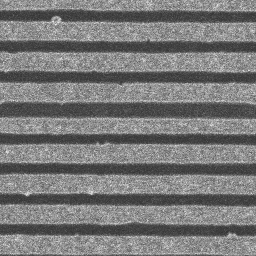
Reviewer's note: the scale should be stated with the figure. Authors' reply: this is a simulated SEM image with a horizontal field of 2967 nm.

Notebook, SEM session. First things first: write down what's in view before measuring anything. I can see parallel lines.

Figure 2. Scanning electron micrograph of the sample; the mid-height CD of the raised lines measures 227 nm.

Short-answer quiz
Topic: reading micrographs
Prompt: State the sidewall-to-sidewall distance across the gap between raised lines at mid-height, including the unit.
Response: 129 nm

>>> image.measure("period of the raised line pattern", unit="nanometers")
354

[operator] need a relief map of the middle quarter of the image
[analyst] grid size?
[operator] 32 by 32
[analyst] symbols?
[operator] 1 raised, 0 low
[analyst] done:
11111111111111111111111111111111
11111111111111111111111111111111
00000000000000000000000000000000
00000000000000000000000000000000
00000000000000000000000000000000
11111111111111111111111111111111
11111111111111111111111111111111
11111111111111111111111111111111
11111111111111111111111111111111
10000110000011111111111111111111
00000000000000000000000000000000
00000000000000000000000000000000
00000000000000000000000000000000
00000111111111110000000000000000
11111111111111111111111111111111
11111111111111111111111111111111
11111111111111111111111111111111
00001110000000000000000001111111
00000000000000000000000000000000
00000000000000000000000000000000
11111111111111111111111111111111
11111111111111111111111111111111
11111111111111111111111111111111
11111111111111111111111111111111
11111111111111111111111111111111
00000000000000000000000000000000
00000000000000000000000000000000
11000000000000000000000000000000
11111111111111111111111111111111
11111111111111111111111111111111
11111111111111111111111111111111
11111111111111111111111111111111